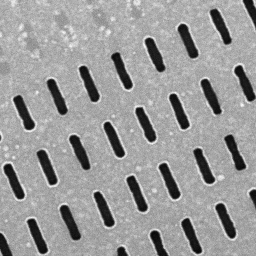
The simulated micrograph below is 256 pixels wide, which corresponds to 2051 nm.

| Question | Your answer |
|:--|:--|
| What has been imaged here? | a regular array of holes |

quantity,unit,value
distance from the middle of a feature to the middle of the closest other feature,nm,285